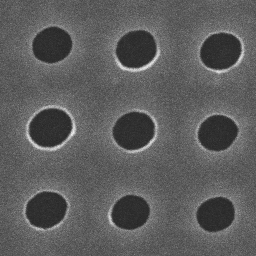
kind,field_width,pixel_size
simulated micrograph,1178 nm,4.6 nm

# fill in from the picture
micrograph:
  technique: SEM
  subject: a regular array of holes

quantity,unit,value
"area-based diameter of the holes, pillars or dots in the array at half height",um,0.182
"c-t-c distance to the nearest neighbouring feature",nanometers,376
